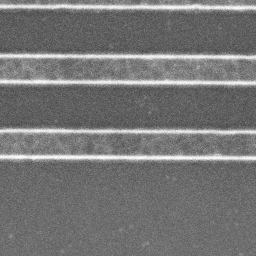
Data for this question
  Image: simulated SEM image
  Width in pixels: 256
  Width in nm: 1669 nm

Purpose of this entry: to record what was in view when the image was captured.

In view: one or a few lines or trenches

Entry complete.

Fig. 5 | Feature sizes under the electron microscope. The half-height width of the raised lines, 0.172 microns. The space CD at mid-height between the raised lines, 316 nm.